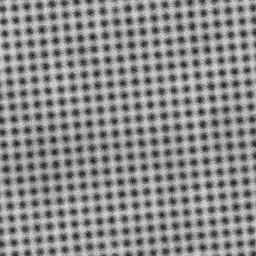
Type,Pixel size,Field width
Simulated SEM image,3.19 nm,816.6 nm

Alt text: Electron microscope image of a regular array of holes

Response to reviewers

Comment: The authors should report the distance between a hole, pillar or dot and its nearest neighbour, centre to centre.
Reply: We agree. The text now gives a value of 38.7 nm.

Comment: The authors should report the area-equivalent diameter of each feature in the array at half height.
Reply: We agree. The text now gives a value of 27.6 nm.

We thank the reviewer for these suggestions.